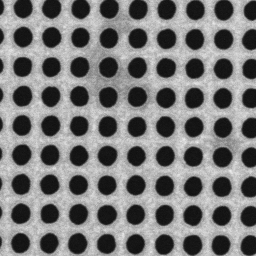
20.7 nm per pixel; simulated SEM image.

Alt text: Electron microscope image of a regular array of holes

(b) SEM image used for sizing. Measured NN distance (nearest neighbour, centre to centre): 591 nm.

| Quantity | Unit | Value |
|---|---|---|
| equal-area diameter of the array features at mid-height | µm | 0.418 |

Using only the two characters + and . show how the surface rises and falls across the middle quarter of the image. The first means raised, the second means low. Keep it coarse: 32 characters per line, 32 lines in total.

+.....+++....+++.....++.....++..
+.....+++....+++.....++.....++..
++....+++....+++....+++.....+++.
+++.++++++++++++++.++++++.+++++.
++++++++++++++++++++++++++++++++
+++..+++++++++++++++++++++++++++
++....+++....++++...++++...++++.
+.....+++....+++.....++.....++..
+.....+++....+++.....++.....++..
++....+++....+++.....++.....++..
+++..+++++..+++++..+++++...++++.
++++++++++++++++++++++++++++++++
++++++++++++++++++++++++++++++++
++...++++...+++++...++++...+++++
++....+++....+++....+++.....++..
+.....++.....+++.....++.....++..
+.....++.....+++.....++.....++..
++...++++....+++....++++...++++.
++++++++++++++++++++++++++++++++
++++++++++++++++++++++++++++++++
+++..+++++..+++++++++++++.++++++
++....+++....+++....++++...++++.
+.....++.....+++....+++.....++..
+.....++.....+++....+++.....++..
++....+++....+++....+++....+++..
+++.++++++..+++++..++++++.+++++.
++++++++++++++++++++++++++++++++
++++++++++++++++++++++++++++++++
++...++++...++++....++++...++++.
+.....+++....+++....+++....+++..
+.....++.....+++.....++.....++..
++....+++....+++....+++....+++..